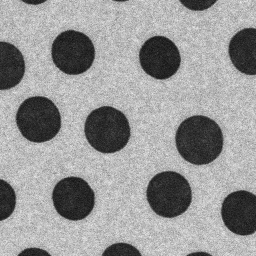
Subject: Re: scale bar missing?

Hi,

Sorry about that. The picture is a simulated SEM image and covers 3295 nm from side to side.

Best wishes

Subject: holes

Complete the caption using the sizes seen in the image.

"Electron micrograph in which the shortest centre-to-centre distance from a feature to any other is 69.7 pixels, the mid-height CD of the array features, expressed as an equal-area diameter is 594 nm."